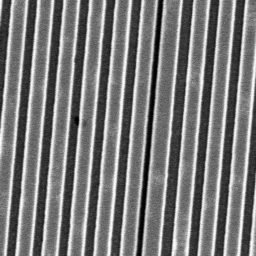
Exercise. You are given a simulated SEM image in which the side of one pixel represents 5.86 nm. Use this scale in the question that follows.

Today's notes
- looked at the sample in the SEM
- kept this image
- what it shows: parallel lines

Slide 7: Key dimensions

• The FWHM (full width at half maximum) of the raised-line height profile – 91.2 nanometres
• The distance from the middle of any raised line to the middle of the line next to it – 152 nm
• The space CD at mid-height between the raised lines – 60.5 nanometres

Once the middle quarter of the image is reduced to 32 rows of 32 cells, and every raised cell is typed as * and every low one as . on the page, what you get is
**...****...***...****..****...*
**...****...***...****.*****...*
**...****...***...****.*****...*
**...****..****...****.*****...*
**...****..****...****.*****...*
**...***...****...***..****....*
**...***...****...***..****....*
**..****...****...***..****....*
**..****...***...****..****...**
**..****...***...****..****...**
**..****...***...****..****...**
*...****...***...****..****...**
*...****...***...****..****...**
*...****...***...****.*****...**
*...****..****...****.*****...**
*...****..****...****.*****...**
*...****..****...***..*****...**
*...***...****...***..*****...**
*..****...****...***..****....**
*...***...****...***..****....**
*..****...****..****..****...***
*..****...****..****..****...***
*..****...***...****..****...***
...****...***...****..****...***
...****..****...****..****...***
...****..****...****.*****...***
...****..****...****.*****...***
...****..****...****.*****...***
...***...****...***..*****...***
...***...****...***..****....***
...***...****...***..****....***
...***...****..****..****...****